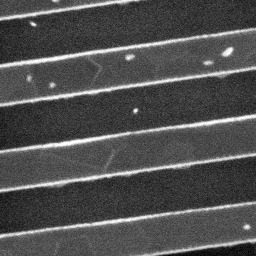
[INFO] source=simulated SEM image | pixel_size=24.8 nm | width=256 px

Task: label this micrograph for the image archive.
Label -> lines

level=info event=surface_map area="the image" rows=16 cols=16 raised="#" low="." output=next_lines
#####...........
................
...........#####
....############
###############.
########........
#...............
..............##
.......#########
################
##########......
###.............
................
.........#######
..##############
#############...